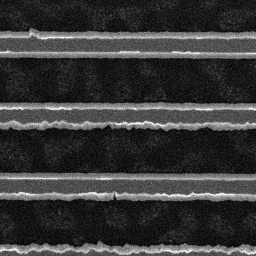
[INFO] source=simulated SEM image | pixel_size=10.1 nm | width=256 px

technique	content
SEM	one or a few lines or trenches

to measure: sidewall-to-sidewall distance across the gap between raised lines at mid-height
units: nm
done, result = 514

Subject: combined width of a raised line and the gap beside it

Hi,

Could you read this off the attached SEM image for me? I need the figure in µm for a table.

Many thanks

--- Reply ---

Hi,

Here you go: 0.716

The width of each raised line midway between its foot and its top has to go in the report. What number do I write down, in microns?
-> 0.199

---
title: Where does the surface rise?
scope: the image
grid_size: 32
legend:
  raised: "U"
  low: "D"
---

DDDDDDDDDDDDDDDDDDDDDDDDDDDDDDDD
DDDDDDDDDDDDDDDDDDDDDDDDDDDDDDDD
DDDDDDDDDDDDDDDDDDDDDDDDDDDDDDDD
DDDDDDDDDDDDDDDDDDDDDDDDDDDDDDDD
UUUUUUUUUUUUUUUUDDUDUUUUUUUDDUUU
UUUUUUUUUUUUUUUUUUUUUUUUUUUUUUUU
UUUUUUUUUUUUUUUUUUUUUUUUUUUUUUUU
DDDDDDDDDDDDDDDDDDDDDDDDDDDDDDDD
DDDDDDDDDDDDDDDDDDDDDDDDDDDDDDDD
DDDDDDDDDDDDDDDDDDDDDDDDDDDDDDDD
DDDDDDDDDDDDDDDDDDDDDDDDDDDDDDDD
DDDDDDDDDDDDDDDDDDDDDDDDDDDDDDDD
DDDDDDDDDDDDDDDDDDDDDDDDDDDDDDDD
UUUUUUUUUUUUUUUUUUUUUUUUUUUUUUUU
UUUUUUUUUUUUUUUUUUUUUUUUUUUUUUUU
UUUUUUUUUUUUUUUUUUUUUUUUUUUUUUUU
DDDDDDDDDDDDDDDDDDDDDDDDDDDDDDDD
DDDDDDDDDDDDDDDDDDDDDDDDDDDDDDDD
DDDDDDDDDDDDDDDDDDDDDDDDDDDDDDDD
DDDDDDDDDDDDDDDDDDDDDDDDDDDDDDDD
DDDDDDDDDDDDDDDDDDDDDDDDDDDDDDDD
DDDDDDDDDDDDDDDDDDDDDDDDDDDDDDDD
UUUUUUUUUUUUUUUUUUUUUUUUUUUUUUUU
UUUUUUUUUUUUUUUUUUUUUUUUUUUUUUUU
UUUUUUDUUUUUUUUUUUUUUUUUUUUUUUUU
DDDDDDDDDDDDDDDDDDDDDDDDDDDDDDDD
DDDDDDDDDDDDDDDDDDDDDDDDDDDDDDDD
DDDDDDDDDDDDDDDDDDDDDDDDDDDDDDDD
DDDDDDDDDDDDDDDDDDDDDDDDDDDDDDDD
DDDDDDDDDDDDDDDDDDDDDDDDDDDDDDDD
DDDDDDDDDDDDDDDDDDDDDDDDDDDDDDDD
UUUUUUUUUUUUUUUUUUUUUUUUUUUUUUUU